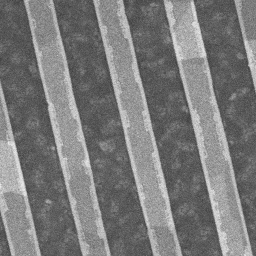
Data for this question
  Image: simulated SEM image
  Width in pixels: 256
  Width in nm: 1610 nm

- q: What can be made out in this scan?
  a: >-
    one or a few lines or trenches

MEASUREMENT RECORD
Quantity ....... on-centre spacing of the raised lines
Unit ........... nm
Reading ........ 432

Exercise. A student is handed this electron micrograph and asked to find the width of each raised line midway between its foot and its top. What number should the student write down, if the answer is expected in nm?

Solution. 162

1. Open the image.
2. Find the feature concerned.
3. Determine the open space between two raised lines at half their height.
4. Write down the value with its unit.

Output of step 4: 270 nm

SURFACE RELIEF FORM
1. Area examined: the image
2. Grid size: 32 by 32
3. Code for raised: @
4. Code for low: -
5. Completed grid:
---@@@@-----@@@------@@@------@@
---@@@@-----@@@------@@@------@@
----@@@-----@@@@-----@@@@-----@@
----@@@------@@@-----@@@@-----@@
----@@@------@@@------@@@------@
----@@@@-----@@@------@@@------@
-----@@@-----@@@@-----@@@@-----@
-----@@@------@@@-----@@@@-----@
-----@@@------@@@------@@@-----@
-----@@@@-----@@@------@@@------
-----@@@@-----@@@@-----@@@------
------@@@------@@@-----@@@@-----
------@@@------@@@------@@@-----
@-----@@@------@@@------@@@-----
@-----@@@@-----@@@@-----@@@-----
@------@@@-----@@@@-----@@@@----
@------@@@------@@@------@@@----
@@-----@@@------@@@------@@@----
@@-----@@@@-----@@@------@@@----
@@------@@@-----@@@@-----@@@@---
@@------@@@------@@@-----@@@@---
@@------@@@------@@@------@@@---
@@@-----@@@@-----@@@------@@@---
@@@-----@@@@-----@@@@-----@@@---
@@@------@@@------@@@-----@@@@--
@@@------@@@------@@@------@@@--
@@@@-----@@@------@@@------@@@--
@@@@-----@@@@-----@@@------@@@--
-@@@------@@@------@@@-----@@@@-
-@@@------@@@------@@@------@@@-
-@@@@-----@@@------@@@------@@@-
--@@@-----@@@@-----@@@------@@@-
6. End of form